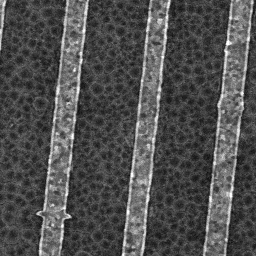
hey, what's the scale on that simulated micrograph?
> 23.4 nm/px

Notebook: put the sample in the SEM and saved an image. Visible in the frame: one or a few lines or trenches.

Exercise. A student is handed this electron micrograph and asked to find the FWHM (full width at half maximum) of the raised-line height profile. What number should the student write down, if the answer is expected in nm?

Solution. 472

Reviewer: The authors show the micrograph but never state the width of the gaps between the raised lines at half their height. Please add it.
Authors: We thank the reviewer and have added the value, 1460 nm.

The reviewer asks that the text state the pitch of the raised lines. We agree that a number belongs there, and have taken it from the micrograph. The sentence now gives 1920 nanometers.